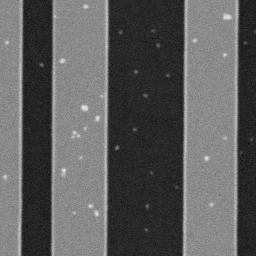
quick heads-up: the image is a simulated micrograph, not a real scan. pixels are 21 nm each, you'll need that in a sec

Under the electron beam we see groups of lines, slits or small figures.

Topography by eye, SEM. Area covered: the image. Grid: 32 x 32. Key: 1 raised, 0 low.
11100001111110000000000111111100
11100001111110000000000111111100
11100001111110000000000111111100
11100001111110000000000111111100
11100001111110000000000111111100
11100001111110000000000111111100
11100001111110000000000111111100
11100001111110000000000111111100
11100001111110000000000111111100
11100001111110000000000111111100
11100001111110000000000111111100
11100001111110000000000111111100
11100001111110000000000111111100
11100001111110000000000111111100
11100001111110000000000111111100
11100001111110000000000111111100
11100001111110000000000111111100
11100001111110000000000111111000
11100001111110000000000111111000
11100001111110000000000111111000
11100001111110000000000111111000
11100001111110000000000111111000
11100001111110000000000111111000
11100001111110000000000111111000
11100001111110000000000111111000
11100001111110000000000111111000
11100001111110000000000111111000
11100001111110000000000111111000
11100001111110000000000111111000
11100001111110000000000111111000
11100001111110000000000111111000
11100001111110000000000111111000